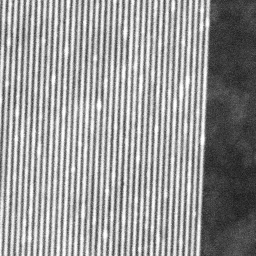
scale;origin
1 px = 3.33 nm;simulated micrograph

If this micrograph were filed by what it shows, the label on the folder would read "parallel lines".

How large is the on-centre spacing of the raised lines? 19.4 nm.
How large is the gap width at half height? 10.4 nm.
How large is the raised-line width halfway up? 2.49 px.